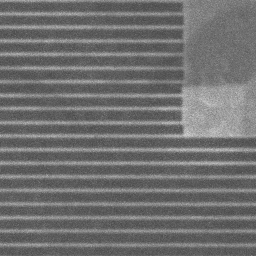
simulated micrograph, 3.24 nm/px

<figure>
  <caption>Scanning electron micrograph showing parallel lines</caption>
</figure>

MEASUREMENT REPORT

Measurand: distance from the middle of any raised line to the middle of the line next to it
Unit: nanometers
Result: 44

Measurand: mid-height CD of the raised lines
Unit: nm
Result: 6.9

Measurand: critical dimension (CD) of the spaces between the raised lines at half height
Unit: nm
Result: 36.5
